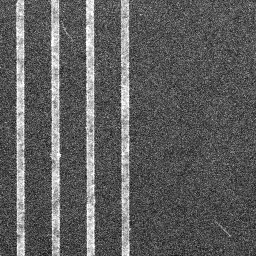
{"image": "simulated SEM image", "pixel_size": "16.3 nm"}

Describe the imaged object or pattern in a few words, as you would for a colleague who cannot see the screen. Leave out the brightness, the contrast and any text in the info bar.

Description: parallel lines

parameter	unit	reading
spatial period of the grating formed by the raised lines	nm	570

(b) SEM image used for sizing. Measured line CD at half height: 110 nanometers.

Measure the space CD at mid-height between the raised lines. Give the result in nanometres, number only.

459